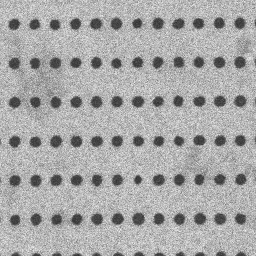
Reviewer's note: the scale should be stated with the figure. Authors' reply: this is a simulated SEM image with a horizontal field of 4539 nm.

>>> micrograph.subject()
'a regular array of holes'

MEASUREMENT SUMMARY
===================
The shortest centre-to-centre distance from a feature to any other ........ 0.361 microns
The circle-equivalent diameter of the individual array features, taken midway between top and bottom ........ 202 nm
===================